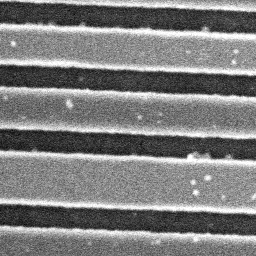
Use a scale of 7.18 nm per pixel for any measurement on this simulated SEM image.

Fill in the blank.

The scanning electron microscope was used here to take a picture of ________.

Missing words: lines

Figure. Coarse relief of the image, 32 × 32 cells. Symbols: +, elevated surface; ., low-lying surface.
.........+++++++++++++++++++++++
................................
................................
+++++++++++.....................
+++++++++++++++++++++++++++++++.
++++++++++++++++++++++++++++++++
++++++++++++++++++++++++++++++++
++++++++++++++++++++++++++++++++
..............++++++++++++++++++
................................
................................
+++++++++++++++.................
++++++++++++++++++++++++++++++++
++++++++++++++++++++++++++++++++
++++++++++++++++++++++++++++++++
++++++++++++++++++++++++++++++++
.............+++++++++++++++++++
................................
................................
++++++++++++....................
++++++++++++++++++++++++++++++++
++++++++++++++++++++++++++++++++
++++++++++++++++++++++++++++++++
++++++++++++++++++++++++++++++++
++++++++++++++++++++++++++++++++
....++++++++++++++++++++++++++++
...............................+
................................
+++.............................
++++++++++++++++++++++++++++++..
++++++++++++++++++++++++++++++++
++++++++++++++++++++++++++++++++